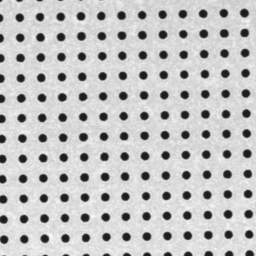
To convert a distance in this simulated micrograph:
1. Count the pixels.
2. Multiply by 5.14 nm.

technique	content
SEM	a regular array of holes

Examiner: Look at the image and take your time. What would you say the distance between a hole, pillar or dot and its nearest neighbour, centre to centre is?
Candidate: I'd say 103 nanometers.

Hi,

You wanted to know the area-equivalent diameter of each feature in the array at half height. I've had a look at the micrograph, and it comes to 45.3 nanometres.